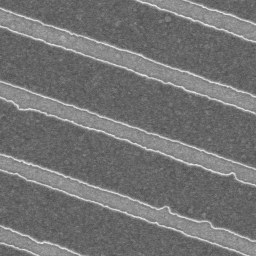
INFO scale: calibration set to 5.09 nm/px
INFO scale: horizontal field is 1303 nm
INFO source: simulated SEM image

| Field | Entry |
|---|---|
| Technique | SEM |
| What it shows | one or a few lines or trenches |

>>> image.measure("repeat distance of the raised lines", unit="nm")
347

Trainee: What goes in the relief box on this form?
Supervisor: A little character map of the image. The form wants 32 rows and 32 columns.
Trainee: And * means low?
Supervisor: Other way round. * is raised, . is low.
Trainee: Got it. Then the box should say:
*******************.....********
.*********************.....*****
....********************......**
*......********************.....
****......********************..
******.......*******************
**********......****************
*************......*************
****************.....***********
******************.......*******
.********************......*****
....********************......**
*......********************.....
***.......********************..
*******.....********************
**********.....*****************
*************.....**************
****************.....***********
******************......********
.********************......*****
....********************......**
*......********************.....
****......********************..
*******.....********************
*********......*****************
*************.....**************
***************......***********
******************......********
.********************......*****
...*********************......**
*.....*********************.....
****.....*********************..